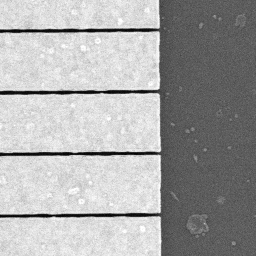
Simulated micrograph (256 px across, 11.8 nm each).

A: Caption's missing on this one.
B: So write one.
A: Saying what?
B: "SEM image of wiring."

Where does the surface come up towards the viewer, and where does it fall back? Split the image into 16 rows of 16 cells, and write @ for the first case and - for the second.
@@@@@@@@@@------
@@@@@@@@@@------
@@@@@@@@@@------
@@@@@@@@@@------
@@@@@@@@@@------
@@@@@@@@@@------
@@@@@@@@@@------
@@@@@@@@@@------
@@@@@@@@@@------
@@@@@@@@@@------
@@@@@@@@@@------
@@@@@@@@@@------
@@@@@@@@@@------
@@@@@@@@@@------
@@@@@@@@@@------
@@@@@@@@@@------